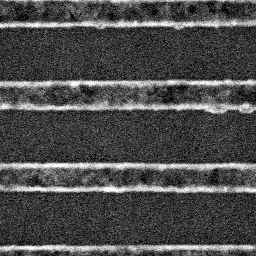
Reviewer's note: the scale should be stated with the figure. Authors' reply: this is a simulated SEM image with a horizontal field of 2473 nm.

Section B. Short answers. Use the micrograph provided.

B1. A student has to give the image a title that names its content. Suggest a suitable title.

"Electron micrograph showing lines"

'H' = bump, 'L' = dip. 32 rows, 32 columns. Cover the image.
HHHHHHHHHHHHHHHHHHHHHHHHHHHHHHHH
HHHHHHHHHHHHHHHHHHHHHHHHHHHHHHHH
HHHHHHHHHHHHHHHHHHHHHHHHHHHHHHHH
LLLLLLLLLLLLLLLLLLLLLLLLLLLLLLLL
LLLLLLLLLLLLLLLLLLLLLLLLLLLLLLLL
LLLLLLLLLLLLLLLLLLLLLLLLLLLLLLLL
LLLLLLLLLLLLLLLLLLLLLLLLLLLLLLLL
LLLLLLLLLLLLLLLLLLLLLLLLLLLLLLLL
LLLLLLLLLLLLLLLLLLLLLLLLLLLLLLLL
LLLLLLLLLLLLLLLLLLLLLLLLLLLLLLLL
LLLLLHHHHHHHHHHHHHHHHHHHHHHHHHHH
HHHHHHHHHHHHHHHHHHHHHHHHHHHHHHHH
HHHHHHHHHHHHHHHHHHHHHHHHHHHHHHHH
LLLLLLLLLLLLLLLLLLLLLLLLLLLHLLLL
LLLLLLLLLLLLLLLLLLLLLLLLLLLLLLLL
LLLLLLLLLLLLLLLLLLLLLLLLLLLLLLLL
LLLLLLLLLLLLLLLLLLLLLLLLLLLLLLLL
LLLLLLLLLLLLLLLLLLLLLLLLLLLLLLLL
LLLLLLLLLLLLLLLLLLLLLLLLLLLLLLLL
LLLLLLLLLLLLLLLLLLLLLLLLLLLLLLLL
LLLLLLLLLLLLLLLLLLLLLLLLLLLLLLLL
HHHHHHHHHHHHHHHHHHHHHHHHHHHHHHHH
HHHHHHHHHHHHHHHHHHHHHHHHHHHHHHHH
HHHHHHHHHHHHHHHHHHHHHHHHHHHHHHHH
LLLLLLLLLLLLLLLLLLLLLLLLLLLLLLLL
LLLLLLLLLLLLLLLLLLLLLLLLLLLLLLLL
LLLLLLLLLLLLLLLLLLLLLLLLLLLLLLLL
LLLLLLLLLLLLLLLLLLLLLLLLLLLLLLLL
LLLLLLLLLLLLLLLLLLLLLLLLLLLLLLLL
LLLLLLLLLLLLLLLLLLLLLLLLLLLLLLLL
LLLLLLLLLLLLLLLLLLLLLLLLLLLLLLLL
HHHHHHHHHHHHHHHHHHHHHHHHHHHHHHHH